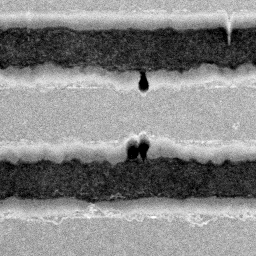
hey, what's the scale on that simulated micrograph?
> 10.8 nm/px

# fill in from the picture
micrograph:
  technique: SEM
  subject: one or a few lines or trenches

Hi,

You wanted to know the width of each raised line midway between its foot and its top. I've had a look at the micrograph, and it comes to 836 nanometers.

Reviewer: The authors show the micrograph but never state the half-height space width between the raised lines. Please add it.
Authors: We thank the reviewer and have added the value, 570 nm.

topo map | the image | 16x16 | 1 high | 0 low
1111111111111111
0000000000000010
0000000000000000
0000000000000000
0000000000000000
1111111111111111
1111111111111111
1111111111111111
1111111111111111
1111101100011111
0000000000000000
0000000000000000
0000000000000000
1111111111111111
1111111111111111
1111111111111111